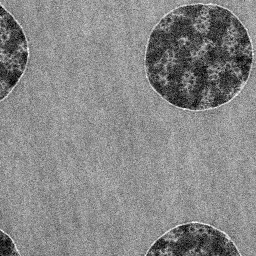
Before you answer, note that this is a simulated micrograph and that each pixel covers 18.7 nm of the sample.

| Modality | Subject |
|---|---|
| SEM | raised bodies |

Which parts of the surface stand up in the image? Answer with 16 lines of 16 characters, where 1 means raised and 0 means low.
0000000000011100
1000000000111110
1100000001111111
1100000001111111
1000000001111111
1000000000111110
0000000000011100
0000000000000000
0000000000000000
0000000000000000
0000000000000000
0000000000000000
0000000000000000
0000000000000000
0000000000011100
1000000001111110